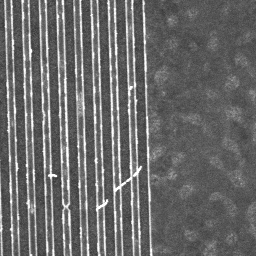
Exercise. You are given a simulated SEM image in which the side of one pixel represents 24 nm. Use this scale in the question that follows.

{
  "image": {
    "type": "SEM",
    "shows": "parallel lines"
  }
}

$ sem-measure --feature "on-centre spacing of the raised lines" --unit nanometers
414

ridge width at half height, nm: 165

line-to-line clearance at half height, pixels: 10.2